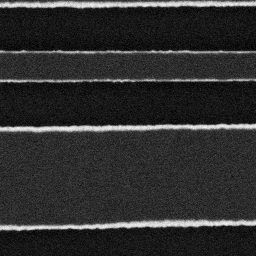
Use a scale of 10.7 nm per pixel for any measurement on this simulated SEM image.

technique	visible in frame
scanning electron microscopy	lines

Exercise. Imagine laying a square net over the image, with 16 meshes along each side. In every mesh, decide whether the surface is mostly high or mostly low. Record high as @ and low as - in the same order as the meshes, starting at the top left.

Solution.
----------------
----------------
----------------
@@@@@@@@@@@@@@@@
@@@@@@@@@@@@@@@@
----------------
----------------
----------------
@@@@@@@@@@@@@@@@
@@@@@@@@@@@@@@@@
@@@@@@@@@@@@@@@@
@@@@@@@@@@@@@@@@
@@@@@@@@@@@@@@@@
@@@@@@@@@@@@@@@@
----------------
----------------